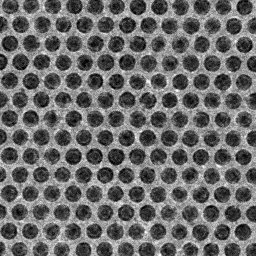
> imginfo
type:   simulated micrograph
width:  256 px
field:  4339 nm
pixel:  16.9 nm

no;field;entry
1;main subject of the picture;a regular array of ring-shaped grooves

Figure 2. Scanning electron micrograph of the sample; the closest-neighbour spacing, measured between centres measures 0.356 micrometres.